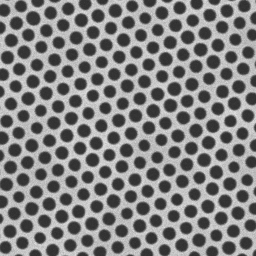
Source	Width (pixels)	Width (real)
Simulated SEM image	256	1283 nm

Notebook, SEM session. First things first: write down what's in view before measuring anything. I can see a regular array of holes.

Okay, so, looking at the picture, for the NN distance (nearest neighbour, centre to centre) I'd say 0.0863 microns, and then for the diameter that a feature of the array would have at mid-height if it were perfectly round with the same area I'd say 0.0657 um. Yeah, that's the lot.